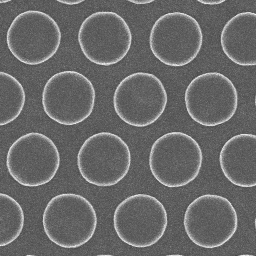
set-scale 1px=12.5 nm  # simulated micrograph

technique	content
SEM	a regular array of raised bodies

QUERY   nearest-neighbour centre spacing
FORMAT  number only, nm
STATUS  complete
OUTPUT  872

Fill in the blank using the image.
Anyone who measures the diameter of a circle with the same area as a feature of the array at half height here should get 0.656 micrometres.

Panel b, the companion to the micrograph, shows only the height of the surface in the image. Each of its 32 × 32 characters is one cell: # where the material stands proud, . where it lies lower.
................................
...##...........................
..#####....####.....####.....###
.######...######...######...####
.######...######...######...####
.######...######...######...####
..#####....#####...######...####
..####.....####.....####.....###
................................
#......###......###......###....
##....#####....#####....#####...
###..#######..#######..######...
###..#######..#######..#######..
###...######..#######..######...
##....#####....#####....#####...
................###......##.....
................................
..####.....####.....####.....###
.######...######...######...####
.######...######...######...####
.######...######...######...####
.######...######...######...####
..####.....####.....####.....###
................................
#......###.......#........#.....
##....#####....#####....#####...
###...######...######..######...
###...######..#######..#######..
###...######...######..######...
##....#####....#####....#####...
#......###......###......###....
................................